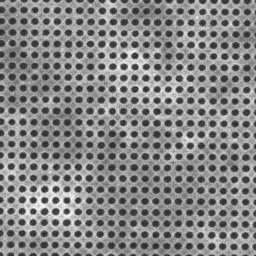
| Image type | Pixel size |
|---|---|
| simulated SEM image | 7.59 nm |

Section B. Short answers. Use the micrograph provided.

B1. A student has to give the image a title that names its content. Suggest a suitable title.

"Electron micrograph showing a regular array of holes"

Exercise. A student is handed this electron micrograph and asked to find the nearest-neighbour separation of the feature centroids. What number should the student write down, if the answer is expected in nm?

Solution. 81.5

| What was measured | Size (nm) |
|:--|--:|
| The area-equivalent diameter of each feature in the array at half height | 57.5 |